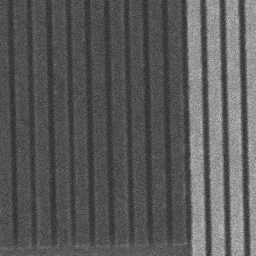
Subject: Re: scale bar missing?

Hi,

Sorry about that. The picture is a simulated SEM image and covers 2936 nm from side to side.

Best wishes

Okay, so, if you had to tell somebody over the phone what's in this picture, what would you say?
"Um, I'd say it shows parallel lines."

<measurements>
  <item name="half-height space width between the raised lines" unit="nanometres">76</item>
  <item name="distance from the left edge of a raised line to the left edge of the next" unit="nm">221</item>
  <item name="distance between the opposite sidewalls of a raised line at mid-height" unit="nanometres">139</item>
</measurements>